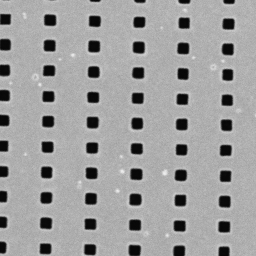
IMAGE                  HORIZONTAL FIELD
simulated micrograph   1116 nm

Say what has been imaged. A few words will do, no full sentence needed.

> a regular array of holes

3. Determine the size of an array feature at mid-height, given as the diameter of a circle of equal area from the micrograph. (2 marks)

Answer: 54.8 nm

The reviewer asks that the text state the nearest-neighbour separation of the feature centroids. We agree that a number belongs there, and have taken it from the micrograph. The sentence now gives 109 nm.